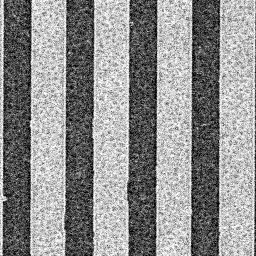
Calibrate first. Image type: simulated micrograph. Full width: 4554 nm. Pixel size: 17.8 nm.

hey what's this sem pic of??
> one or a few lines or trenches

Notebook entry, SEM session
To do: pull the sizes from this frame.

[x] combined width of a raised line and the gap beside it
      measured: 1120 nm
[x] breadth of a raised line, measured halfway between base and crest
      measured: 587 nanometres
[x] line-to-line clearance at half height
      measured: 525 nm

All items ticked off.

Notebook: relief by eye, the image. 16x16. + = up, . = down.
..++..++..++..++
..++..++..++..++
..++..++..++..++
..++..++..++..++
..++..++..++..++
..++..++..++..++
..++..++..++..++
..++..++..++..++
..++..++..++..++
..++..++..++..++
..++..++..++..++
..++..++..++..++
..++..++..++..++
..++..++..++..++
..++..++..++..++
..++..++..++..++